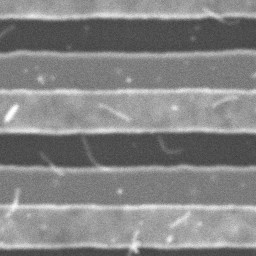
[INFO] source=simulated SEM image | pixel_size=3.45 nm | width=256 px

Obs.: lines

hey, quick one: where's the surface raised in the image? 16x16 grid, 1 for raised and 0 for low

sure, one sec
1111111111111111
0000000000000000
0000000000000000
1111111111111111
1111111111111111
1111111111111111
1111111111111111
1111111111111111
0000000000000000
0000000000000000
1111000011111111
1111111111111111
1111111111111111
1111111111111111
1111111111111111
1000000010100000